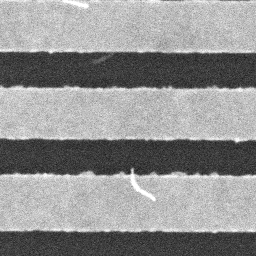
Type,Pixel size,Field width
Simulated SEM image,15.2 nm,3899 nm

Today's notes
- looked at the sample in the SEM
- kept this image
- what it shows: lines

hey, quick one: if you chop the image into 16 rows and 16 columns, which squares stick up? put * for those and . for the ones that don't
****************
****************
****************
................
................
..*.............
****************
****************
****************
................
................
****************
****************
****************
................
................